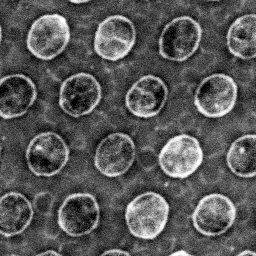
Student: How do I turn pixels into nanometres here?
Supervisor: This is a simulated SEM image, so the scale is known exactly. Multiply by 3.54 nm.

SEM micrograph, a regular array of raised bodies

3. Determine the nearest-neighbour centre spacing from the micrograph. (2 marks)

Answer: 0.234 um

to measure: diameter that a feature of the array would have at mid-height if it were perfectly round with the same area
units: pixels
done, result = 40.4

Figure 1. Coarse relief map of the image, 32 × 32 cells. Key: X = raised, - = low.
--------------------------------
--------------------------------
-----XXX-----XXX------XX------XX
----XXXX----XXXXX----XXXX----XXX
----XXXX----XXXXX---XXXXX----XXX
----XXXX----XXXXX---XXXXX----XXX
----XXX-----XXXX----XXXX-----XXX
--------------------------------
--------------------------------
-XX------XX----------------X----
XXXX----XXXX-----XXX-----XXXX---
XXXX----XXXX----XXXXX----XXXX---
XXXX----XXXX----XXXXX----XXXX---
XXX-----XXXX----XXXX-----XXXX---
XX----------------X-------------
--------------------------------
--------------------------------
----XXXX-----XXX------XX------XX
----XXXX----XXXXX----XXXX----XXX
---XXXXX----XXXXX---XXXXX---XXXX
----XXXX----XXXX----XXXXX----XXX
----XXX------XXX-----XXX-----XXX
--------------------------------
--------------------------------
-XX------XX-------XX------XX----
XXXX----XXXX----XXXXX----XXXX---
XXXX---XXXXX----XXXXX---XXXXX---
XXXX---XXXXX----XXXXX---XXXXX---
XXX-----XXXX----XXXX-----XXX----
-----------------XX-------------
--------------------------------
------X------XX-----------------